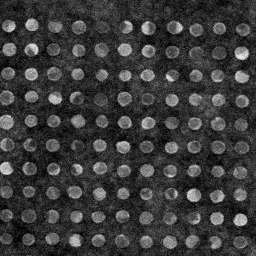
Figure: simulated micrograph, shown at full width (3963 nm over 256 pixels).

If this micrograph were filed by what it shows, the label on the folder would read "a regular array of raised bodies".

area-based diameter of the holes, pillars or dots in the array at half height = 193 nm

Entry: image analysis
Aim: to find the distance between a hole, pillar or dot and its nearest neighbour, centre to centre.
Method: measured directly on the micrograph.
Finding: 351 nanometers